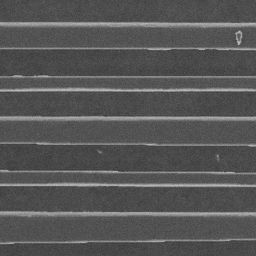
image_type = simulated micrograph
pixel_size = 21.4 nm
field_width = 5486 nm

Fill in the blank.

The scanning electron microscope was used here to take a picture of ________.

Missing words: lines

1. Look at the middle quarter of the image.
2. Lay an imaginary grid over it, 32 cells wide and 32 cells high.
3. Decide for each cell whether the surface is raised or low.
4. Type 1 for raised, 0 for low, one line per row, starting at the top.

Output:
00000000000000000000000000000000
00000000000000000000000000000000
00000000000000000000000000000000
11111111111111111111111111111111
11111111111111111111111111111111
11111111111111111111111111111111
00000000000000000000000000000000
00000000000000000000000000000000
00000000000000000000000000000000
00000000000000000000000000000000
00000000000000000000000000000000
00000000000000000000000000000000
00000000000000000000000000000000
00000000000000000000000000000000
11111111111111111111111111111111
11111111111111111111111111111111
11111111111111111111111111111111
11111111111111111111111111111111
11111111111111111111111111111111
11111111111111111111111111111111
00000000000000000000000000000000
00000000000000000000000000000000
00000000000000000000000000000000
00000000000000000000000000000000
00000000000000000000000000000000
00000000000000000000000000000000
00000000000000000000000000000000
11111111111111111111111111111111
11111111111111111111111111111111
11111111111111111111111111111111
00000000000000000000000000000000
00000000000000000000000000000000